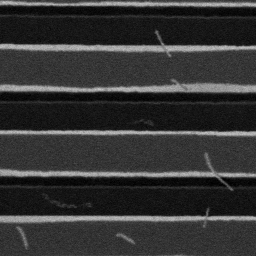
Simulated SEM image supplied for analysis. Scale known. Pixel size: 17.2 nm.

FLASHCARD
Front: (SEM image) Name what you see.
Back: lines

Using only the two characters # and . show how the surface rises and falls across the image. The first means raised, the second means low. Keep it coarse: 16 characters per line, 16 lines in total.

................
................
................
################
################
################
................
................
################
################
################
................
................
................
################
################